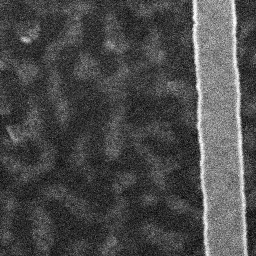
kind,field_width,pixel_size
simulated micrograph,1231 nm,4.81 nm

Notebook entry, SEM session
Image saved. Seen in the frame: one or a few lines or trenches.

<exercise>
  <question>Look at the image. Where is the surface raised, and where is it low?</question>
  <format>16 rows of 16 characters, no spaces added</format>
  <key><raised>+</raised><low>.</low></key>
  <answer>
............+++.
............+++.
............+++.
............+++.
............+++.
............+++.
............+++.
............+++.
............+++.
.............++.
.............++.
.............++.
.............++.
.............++.
.............++.
.............++.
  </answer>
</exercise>